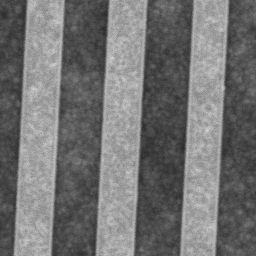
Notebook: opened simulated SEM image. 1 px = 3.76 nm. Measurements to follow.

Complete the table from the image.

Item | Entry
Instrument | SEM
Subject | one or a few lines or trenches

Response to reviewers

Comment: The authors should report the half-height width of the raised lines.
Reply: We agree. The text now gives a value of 0.132 um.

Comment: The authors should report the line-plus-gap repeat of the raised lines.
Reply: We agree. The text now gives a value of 310 nm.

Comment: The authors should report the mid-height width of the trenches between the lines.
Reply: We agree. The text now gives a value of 0.179 microns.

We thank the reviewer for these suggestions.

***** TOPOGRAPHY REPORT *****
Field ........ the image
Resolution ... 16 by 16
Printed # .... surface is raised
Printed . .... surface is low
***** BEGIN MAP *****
..##...##...##..
..##...##...##..
..##...##...##..
..##...##...##..
..##...##...##..
.###...##...##..
.###...##...##..
.###...##...##..
.##...###...##..
.##...###...##..
.##...###...##..
.##...###...##..
.##...##....##..
.##...##...###..
.##...##...##...
.##...##...##...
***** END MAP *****